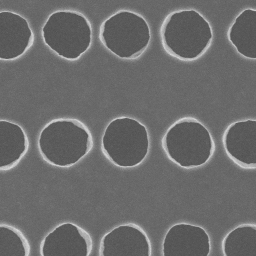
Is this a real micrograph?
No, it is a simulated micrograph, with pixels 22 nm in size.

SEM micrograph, holes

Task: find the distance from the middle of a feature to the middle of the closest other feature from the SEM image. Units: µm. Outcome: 1.34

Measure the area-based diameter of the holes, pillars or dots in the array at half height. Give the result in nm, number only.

1020